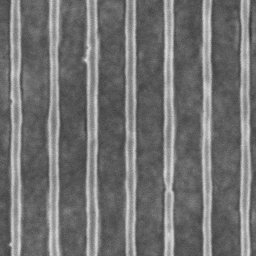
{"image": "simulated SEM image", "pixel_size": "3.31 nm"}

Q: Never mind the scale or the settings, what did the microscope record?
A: parallel lines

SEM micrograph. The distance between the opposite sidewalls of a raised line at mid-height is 26.5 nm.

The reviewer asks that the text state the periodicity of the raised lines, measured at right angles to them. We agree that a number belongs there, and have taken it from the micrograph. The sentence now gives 126 nanometers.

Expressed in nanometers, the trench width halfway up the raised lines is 100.